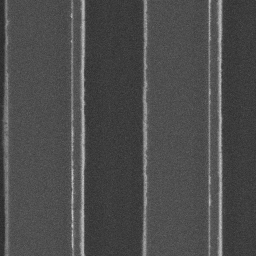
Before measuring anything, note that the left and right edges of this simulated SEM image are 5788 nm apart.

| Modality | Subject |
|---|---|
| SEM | lines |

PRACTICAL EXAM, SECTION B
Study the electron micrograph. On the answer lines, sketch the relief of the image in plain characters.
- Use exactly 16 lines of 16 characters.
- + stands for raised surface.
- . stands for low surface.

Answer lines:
+++++....+++++..
+++++....+++++..
+++++....+++++..
+++++....+++++..
+++++....+++++..
+++++....+++++..
+++++....+++++..
+++++....+++++..
+++++....+++++..
+++++....+++++..
+++++....+++++..
+++++....+++++..
+++++....+++++..
+++++....+++++..
+++++....+++++..
+++++....+++++..